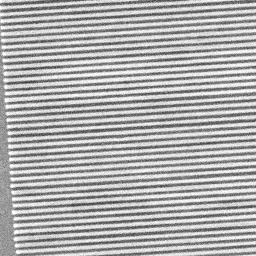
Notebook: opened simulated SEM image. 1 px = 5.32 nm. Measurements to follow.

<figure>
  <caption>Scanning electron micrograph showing parallel lines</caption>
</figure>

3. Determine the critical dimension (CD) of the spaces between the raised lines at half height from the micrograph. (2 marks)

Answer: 3.74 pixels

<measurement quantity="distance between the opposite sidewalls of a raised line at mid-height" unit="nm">15.3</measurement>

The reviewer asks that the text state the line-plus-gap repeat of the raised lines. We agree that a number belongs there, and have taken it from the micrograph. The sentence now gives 35.2 nm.